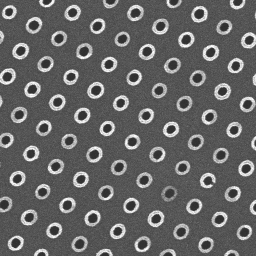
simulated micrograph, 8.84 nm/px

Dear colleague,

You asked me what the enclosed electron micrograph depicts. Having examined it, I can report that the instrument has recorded a regular array of ring-shaped raised bodies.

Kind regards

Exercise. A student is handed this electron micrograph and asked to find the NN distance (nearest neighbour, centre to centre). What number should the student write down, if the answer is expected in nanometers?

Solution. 247